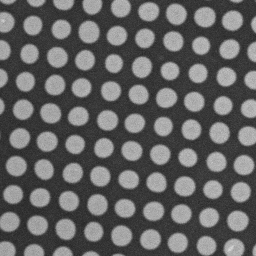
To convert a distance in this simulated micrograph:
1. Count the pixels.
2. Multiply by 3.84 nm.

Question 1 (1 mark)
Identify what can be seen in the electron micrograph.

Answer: an array of small figures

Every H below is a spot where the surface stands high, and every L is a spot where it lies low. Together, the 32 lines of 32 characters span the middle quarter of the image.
LLLHHHHLLLHHHHHLLHHHHHLLLHHHLLLL
LLLLLLLLLLLHHHLLLHHHHHLLHHHHHLLH
LLLLLLLLLLLLLLLLLLHHHLLLHHHHHLLH
LLLLLLLLLLLLLLLLLLLLLLLLLHHHLLLL
LLLHHHLLLLLHLLLLLLLLLLLLLLLLLLLL
LLHHHHHLLLHHHHLLLLHHLLLLLLLLLLLL
LLHHHHHLLHHHHHLLHHHHHLLLHHHLLLLL
LLLHHHLLLHHHHHLLHHHHHLLHHHHHLLLH
LLLLLLLLLLHHHLLLHHHHHLLHHHHHLLHH
LLLLLLLLLLLLLLLLLHHHLLLHHHHHLLHH
LLLLLLLLLLLLLLLLLLLLLLLLHHHLLLHH
LLHHHLLLLLLLLLLLLLLLLLLLLLLLLLLH
LHHHHHLLLHHHHLLLLLLLLLLLLLLLLLLL
LHHHHHLLHHHHHLLLHHHHLLLLHHLLLLLL
LHHHHHLLHHHHHLLHHHHHLLLHHHHLLLHH
LLLLLLLLLHHHHLLHHHHHLLLHHHHLLLHH
LLLLLLLLLLHHLLLLHHHLLLLHHHHLLLHH
LLLLLLLLLLLLLLLLLLLLLLLLHHLLLLHH
LHHHLLLLLLLLLLLLLLLLLLLLLLLLLLHH
HHHHHLLLHHHHLLLLHHLLLLLLLLLLLLLL
LHHHHLLLHHHHLLLHHHHLLLLHHLLLLLLL
LHHHHLLLHHHHLLHHHHHLLLHHHHLLLLHH
LLLLLLLLHHHHLLLHHHHLLLHHHHLLLHHH
LLLLLLLLLLLLLLLHHHHLLLHHHHLLLHHH
LLLLLLLLLLLLLLLLLLLLLLHHHHLLLHHH
LHHHLLLLLLLLLLLLLLLLLLLLLLLLLLHH
HHHHHLLHHHHLLLLLLLLLLLLLLLLLLLLL
HHHHHLLHHHHLLLHHHHLLLLHHLLLLLLLL
HHHHLLLHHHHLLLHHHHHLLHHHHLLLLHHL
LHHLLLLHHHHLLLHHHHHLLHHHHLLLHHHH
LLLLLLLLLHLLLLHHHHLLLHHHHHLLHHHH
LLLLLLLLLLLLLLLLLLLLLLHHHLLLHHHH